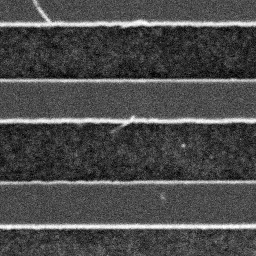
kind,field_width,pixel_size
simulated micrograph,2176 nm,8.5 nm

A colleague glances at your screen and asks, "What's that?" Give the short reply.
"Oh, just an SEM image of lines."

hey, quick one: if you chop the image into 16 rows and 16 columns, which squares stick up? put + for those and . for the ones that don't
++++++++++++++++
++++++++++++++++
................
................
................
++++++++++++++++
++++++++++++++++
++++++++++++++++
................
................
................
++++++++++++++++
++++++++++++++++
++++++++++++++++
................
................